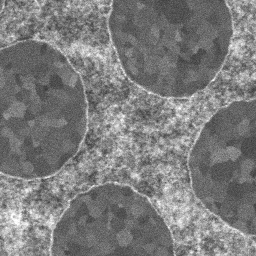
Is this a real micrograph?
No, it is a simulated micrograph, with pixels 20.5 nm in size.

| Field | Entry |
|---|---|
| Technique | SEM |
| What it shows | raised bodies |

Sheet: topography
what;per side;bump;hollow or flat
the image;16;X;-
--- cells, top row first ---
-------XXXXXXX--
-------XXXXXXXX-
-------XXXXXXX--
XXXX---XXXXXXX--
XXXXX---XXXXXX--
XXXXX----XXXX---
XXXXX---------XX
XXXXX--------XXX
XXXXX-------XXXX
XXXXX-------XXXX
XXXX--------XXXX
------XX----XXXX
-----XXXX---XXXX
----XXXXXX----XX
---XXXXXXXX----X
---XXXXXXXX-----